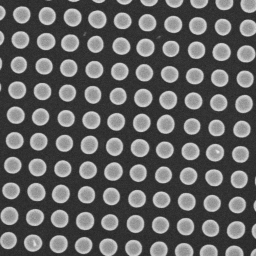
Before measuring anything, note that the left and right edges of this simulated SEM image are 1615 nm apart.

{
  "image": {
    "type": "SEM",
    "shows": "an array of small figures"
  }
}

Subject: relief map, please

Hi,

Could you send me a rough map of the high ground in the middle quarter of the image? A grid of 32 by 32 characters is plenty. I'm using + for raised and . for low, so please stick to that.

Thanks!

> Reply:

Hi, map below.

+++...++++..++++...++...........
+++..+++++..++++..++++..++++...+
+++...++++..++++..++++..+++++.++
............+++...++++...+++...+
..........................+....+
++..............................
+++..++++...+++....++...........
+++..++++...+++...++++..++++...+
++...++++...++++..++++..++++..++
......+++...+++...++++..++++..++
...................++...++++...+
................................
++...+++....++.....+............
+++..++++..++++...+++...+++.....
++...++++..++++..+++++.+++++..++
++...++++..++++..++++..+++++..++
............++....+++...+++...++
................................
++...+++........................
++..++++...+++...++++....+......
++..++++...++++..++++..++++...++
+...++++...++++..++++..++++...++
...........+++...++++..++++..+++
........................++....++
+....++.........................
++..++++...+++...+++............
++..++++..+++++..++++..++++...++
+...++++..+++++.+++++..++++..+++
.....++....+++...+++...++++..+++
.......................+++....++
................................
+...+++...+++...................